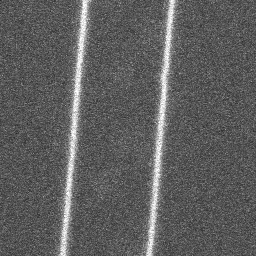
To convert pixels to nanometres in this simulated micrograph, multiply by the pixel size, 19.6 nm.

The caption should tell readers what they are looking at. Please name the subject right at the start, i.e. one or a few lines or trenches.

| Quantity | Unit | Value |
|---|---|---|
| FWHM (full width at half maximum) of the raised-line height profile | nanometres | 1690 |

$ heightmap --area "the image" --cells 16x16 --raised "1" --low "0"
0000011111100000
0000011111100000
0000011111100000
0000011111000000
0000011111000000
0000011111000000
0000011111000000
0000011111000000
0000011111000000
0000011111000000
0000111111000000
0000111111000000
0000111111000000
0000111111000000
0000111110000000
0000111110000000